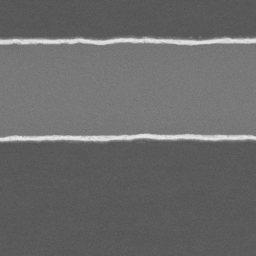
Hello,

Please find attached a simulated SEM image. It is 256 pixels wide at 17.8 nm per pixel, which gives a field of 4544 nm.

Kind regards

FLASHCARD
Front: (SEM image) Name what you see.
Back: one or a few lines or trenches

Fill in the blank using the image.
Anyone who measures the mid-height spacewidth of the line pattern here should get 1.73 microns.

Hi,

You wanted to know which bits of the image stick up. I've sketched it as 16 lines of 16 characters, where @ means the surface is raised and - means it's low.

@@@@@@@@@@@@@@@@
@@@@@@@@@@@@@@@@
@@@@@@@@@@@@@@@@
----------------
----------------
----------------
----------------
----------------
----------------
@@@@@@@@@@@@@@@@
@@@@@@@@@@@@@@@@
@@@@@@@@@@@@@@@@
@@@@@@@@@@@@@@@@
@@@@@@@@@@@@@@@@
@@@@@@@@@@@@@@@@
@@@@@@@@@@@@@@@@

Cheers